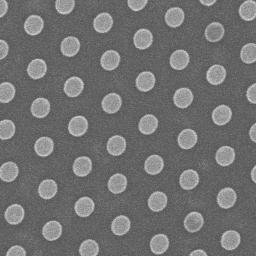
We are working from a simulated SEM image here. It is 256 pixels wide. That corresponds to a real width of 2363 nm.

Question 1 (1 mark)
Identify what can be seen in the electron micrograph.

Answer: a regular array of raised bodies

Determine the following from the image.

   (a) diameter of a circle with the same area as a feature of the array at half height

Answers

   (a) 176 nanometers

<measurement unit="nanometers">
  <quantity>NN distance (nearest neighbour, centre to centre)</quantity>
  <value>364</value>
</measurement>